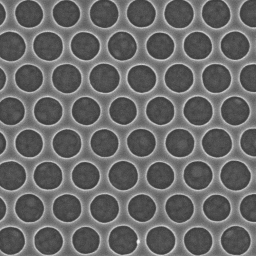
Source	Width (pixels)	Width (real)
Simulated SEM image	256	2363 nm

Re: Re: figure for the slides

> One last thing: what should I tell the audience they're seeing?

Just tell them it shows a regular array of holes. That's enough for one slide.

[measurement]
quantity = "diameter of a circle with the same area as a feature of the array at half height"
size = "268 nm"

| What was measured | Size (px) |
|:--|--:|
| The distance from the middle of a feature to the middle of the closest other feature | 37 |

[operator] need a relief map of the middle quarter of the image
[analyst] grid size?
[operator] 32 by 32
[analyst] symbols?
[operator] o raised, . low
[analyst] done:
...ooooo....oooooo...oooooo....o
....ooo......ooo......oooo......
....oo........oo.......oo.......
....oo........oo.......oo.......
....oo........oo.......oo.......
....ooo......ooo.......ooo......
...ooooo.....oooo.....ooooo....o
.ooooooooooooooooooooooooooooooo
oooo...oooooo...ooooooo..ooooooo
ooo.....oooo.....oooo......oooo.
oo.......oo.......ooo......ooo..
oo.......oo.......oo........oo..
oo.......oo.......oo........oo..
oo.......ooo......ooo......ooo..
ooo.....ooooo....ooooo....ooooo.
oooooooooooooooooooooooooooooooo
..ooooooo..ooooooo...oooooo....o
....ooo......ooo......oooo......
....ooo.......oo.......oo.......
.....oo.......oo.......oo.......
.....oo.......oo.......oo.......
....ooo......ooo.......ooo......
...ooooo.....oooo.....ooooo.....
..oooooooooooooooooooooooooooooo
oooo..ooooooo...ooooooo..ooooooo
ooo.....oooo......oooo.....oooo.
oo.......oo.......ooo......ooo..
oo.......oo........oo.......oo..
oo.......oo........oo.......oo..
oo.......ooo......ooo......ooo..
ooo.....oooo......oooo....ooooo.
oooooooooooooo..oooooooooooooooo